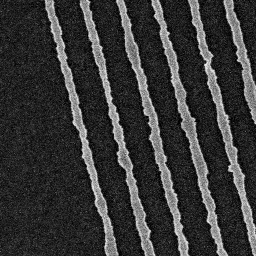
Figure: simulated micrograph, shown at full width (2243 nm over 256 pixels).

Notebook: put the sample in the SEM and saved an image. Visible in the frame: parallel lines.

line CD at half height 65.8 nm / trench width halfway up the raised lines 234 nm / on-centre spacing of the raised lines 306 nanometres